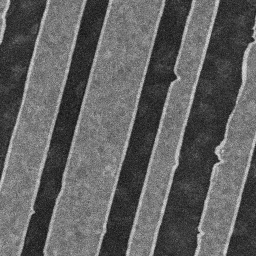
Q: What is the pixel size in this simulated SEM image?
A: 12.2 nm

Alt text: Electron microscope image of one or a few lines or trenches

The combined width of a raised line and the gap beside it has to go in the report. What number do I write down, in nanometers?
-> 818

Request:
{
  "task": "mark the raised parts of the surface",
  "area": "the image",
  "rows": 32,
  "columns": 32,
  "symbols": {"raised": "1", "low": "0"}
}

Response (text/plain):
10000011110000111111000011100000
10000011110001111111000011100000
00000111110001111111000011100000
00000111110001111111000111000000
00000111100001111110000111000000
00000111100011111110000111000000
00001111100011111110000111000001
00001111100011111100001110000001
00001111000011111100001110000001
00001111000111111100001110000001
00011111000111111100001100000011
00011111000111111000011100000011
00011110000111111000011100000011
00011110001111111000011100000111
00111110001111111000111000000111
00111110001111110000111000000111
00111100001111110000111000001111
00111100011111110000111000001111
01111100011111110001110000011111
01111100011111100001110000011110
01111000111111100001110000011110
01111000111111100001110000011110
11111000111111100011100000111100
11111000111111000011100000111100
11110001111111000011100000111100
11110001111111000111100000111100
11110001111110000111000000111000
11110001111110000111000001111000
11100011111110000111000001111000
11100011111110001110000001111000
11100011111100001110000001110000
11000011111100001110000001110000